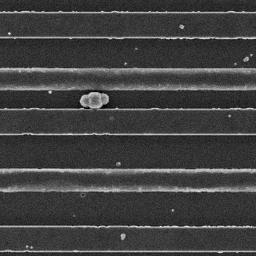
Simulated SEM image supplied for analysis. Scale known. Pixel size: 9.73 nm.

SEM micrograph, lines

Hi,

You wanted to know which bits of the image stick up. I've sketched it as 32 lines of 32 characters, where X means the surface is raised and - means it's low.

--------------------------------
XXXXXX-X-X--X-XX--X-X---X---XXX-
XXXXXXXXXXXXXXXXXXXXXXXXXXXXXXXX
XXXXXXXXXXXXXXXXXXXXXXXXXXXXXXXX
XXXXXXXXXXXXXXXXXXXXXXXXXXXXXXXX
--------------------------------
--------------------------------
--------------------------------
--------------------------------
XXXXXXXXXXXXXXXXXXXXXXXXXXXXXXXX
XXXXXXXXXXXXXXXXXXXXXXXXXXXXXXXX
--------------------------------
----------XXX-------------------
----------XXX-------------------
XXXXXXXXXXXXXXXXXXXXXXXXXXXXXXXX
XXXXXXXXXXXXXXXXXXXXXXXXXXXXXXXX
XXXXXXXXXXXXXXXXXXXXXXXXXXXXXXXX
--------------------------------
--------------------------------
--------------------------------
--------------------------------
XXXXXXXXXXXXXXXXXXXXXXXXXXXXXXXX
XXXXXXXXXXXXXXXXXXXXXXXXXXXXXXXX
XXXXXXXXXXXXXXXXXXXXXXXXXXXXXXXX
--------------------------------
--------------------------------
--------------------------------
--------------------------------
XXXXXXXXXXXXXXXXXXXXXXXXXXXXXXXX
XXXXXXXXXXXXXXXXXXXXXXXXXXXXXXXX
XXXXXXXXXXXXXXXXXXXXXXXXXXXXXXXX
---------------------------X----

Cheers